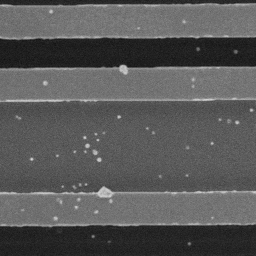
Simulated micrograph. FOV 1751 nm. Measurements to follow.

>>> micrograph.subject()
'lines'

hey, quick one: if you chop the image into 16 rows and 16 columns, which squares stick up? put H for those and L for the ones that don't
HHHHHHHHHHHHHHHH
HHHHHHHHHHHHHHHH
LLLLLLLLLLLLLLLL
LLLLLLLLLLLLLLLL
HHHHHHHHHHHHHHHH
HHHHHHHHHHHHHHHH
LLLLLLLLLLLLLLLL
LLLLLLLLLLLLLLLL
LLLLLLLLLLLLLLLL
LLLLLLLLLLLLLLLL
LLLLLLLLLLLLLLLL
LLLLLLLLLLLLLLLL
HHHHHHHHHHHHHHHH
HHHHHHHHHHHHHHHH
LLLLLLLLLLLLLLLL
LLLLLLLLLLLLLLLL